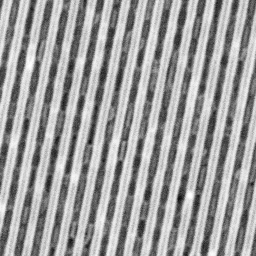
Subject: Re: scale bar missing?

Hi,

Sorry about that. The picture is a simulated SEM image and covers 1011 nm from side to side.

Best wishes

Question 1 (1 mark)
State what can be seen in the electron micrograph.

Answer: parallel lines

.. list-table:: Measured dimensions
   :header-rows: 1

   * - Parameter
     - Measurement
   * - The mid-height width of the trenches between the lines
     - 37.4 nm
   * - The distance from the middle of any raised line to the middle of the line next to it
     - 65.6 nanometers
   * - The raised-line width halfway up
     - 27.2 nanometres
